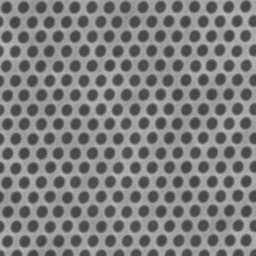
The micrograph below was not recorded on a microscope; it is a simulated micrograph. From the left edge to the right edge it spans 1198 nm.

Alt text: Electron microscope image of a regular array of holes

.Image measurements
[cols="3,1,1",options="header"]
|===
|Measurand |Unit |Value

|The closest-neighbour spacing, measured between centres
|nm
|76.9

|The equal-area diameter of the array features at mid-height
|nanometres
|57.8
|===